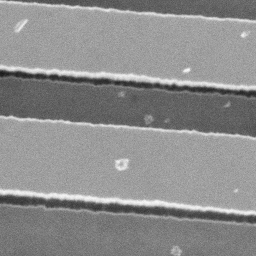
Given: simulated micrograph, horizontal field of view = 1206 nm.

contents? lines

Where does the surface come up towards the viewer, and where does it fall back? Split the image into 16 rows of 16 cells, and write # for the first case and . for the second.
######..........
################
################
################
..##############
..............##
................
##..............
###############.
################
################
################
......##########
................
................
................